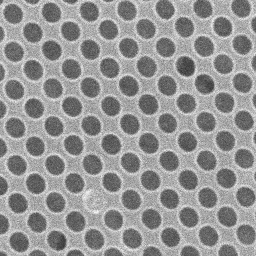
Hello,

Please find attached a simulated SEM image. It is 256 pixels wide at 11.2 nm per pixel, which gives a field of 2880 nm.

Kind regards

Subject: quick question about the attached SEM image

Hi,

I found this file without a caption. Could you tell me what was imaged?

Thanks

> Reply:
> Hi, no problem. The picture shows a regular array of holes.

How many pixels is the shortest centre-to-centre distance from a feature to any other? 26.4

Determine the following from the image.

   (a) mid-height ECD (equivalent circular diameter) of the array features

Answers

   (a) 238 nm